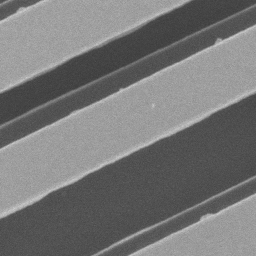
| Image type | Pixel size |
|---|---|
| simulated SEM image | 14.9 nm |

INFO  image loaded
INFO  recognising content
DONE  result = lines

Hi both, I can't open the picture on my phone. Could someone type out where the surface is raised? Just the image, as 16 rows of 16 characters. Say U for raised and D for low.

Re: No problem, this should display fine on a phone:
DDUUUUUUUUUDDDDD
UUUUUUUUUDDDDDDD
UUUUUUUDDDDDDDUU
UUUUUDDDDDDDUUUU
UUUDDDDDDDUUUUUU
UDDDDDDDUUUUUUUU
DDDDDDUUUUUUUUDD
DDDDUUUUUUUUDDDD
DDUUUUUUUUDDDDDD
UUUUUUUUDDDDDDDD
UUUUUUDDDDDDDDDD
UUUUDDDDDDDDDDDD
UUDDDDDDDDDDDDDU
DDDDDDDDDDDDDUUU
DDDDDDDDDDDUUUUU
DDDDDDDDDUUUUUUU